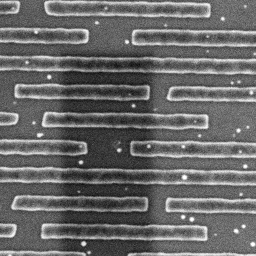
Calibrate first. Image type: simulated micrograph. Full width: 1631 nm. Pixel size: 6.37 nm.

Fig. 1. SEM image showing wiring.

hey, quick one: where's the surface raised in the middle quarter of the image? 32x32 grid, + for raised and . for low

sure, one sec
++++++++++++++++++++++++++++++++
++++++++++++++++++++++++++++++++
................................
................................
................................
++++++++++++++++....+...........
+++++++++++++++++++++.....++++++
+++++++++++++++++++++.....++++++
+++++++++++++++++++++.....++++++
................................
................................
................................
++++++++++++++++++..............
++++++++++++++++++++++++++++++++
++++++++++++++++++++++++++++++++
++++++++++++++++++++++++++++++++
................................
................................
................................
+++..............++.++++......++
+++++............+++++++++++++++
++++++...........+++++++++++++++
+++++............+++++++++++++++
................................
................................
................................
+++++++++++++++.................
++++++++++++++++++++++++++++++++
++++++++++++++++++++++++++++++++
++++++++++++++++++++++++++++++++
................................
................................